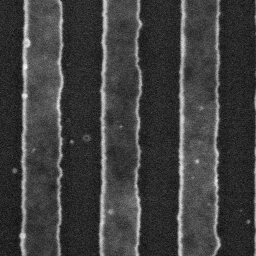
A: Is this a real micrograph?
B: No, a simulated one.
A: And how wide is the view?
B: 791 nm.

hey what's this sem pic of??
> lines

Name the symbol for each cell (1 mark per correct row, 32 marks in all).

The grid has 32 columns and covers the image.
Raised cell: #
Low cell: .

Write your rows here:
...#####.....####......####.....
...#####.....####......####.....
...#####.....####......####.....
...#####.....#####.....####.....
...#####.....####......####.....
...#####.....####......####.....
...#####.....####......####.....
...#####.....####......####.....
...#####.....####......####.....
...#####.....#####.....####.....
...#####.....#####.....####.....
...#####.....#####.....####.....
...####......####......####.....
...####......####......####.....
...####......####......####.....
...#####.....####......####.....
...#####.....####......####.....
...#####.....####......####.....
...#####.....####.....#####.....
...#####.....####.....#####.....
...####......####......####.....
...#####.....####.....#####.....
...####......####......####.....
...####......####.....#####.....
...####......####.....#####.....
...####......####.....#####.....
...#####.....#####....#####.....
...#####.....####.....#####.....
...####......####.....#####.....
...####......####.....#####.....
...####......####.....#####.....
...####......####.....#####.....